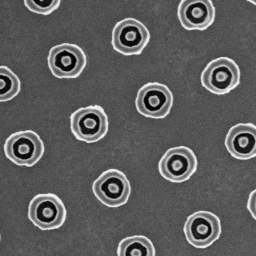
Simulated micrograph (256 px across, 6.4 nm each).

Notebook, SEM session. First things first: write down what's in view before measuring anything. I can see a regular array of ring-shaped raised bodies with a dot in the middle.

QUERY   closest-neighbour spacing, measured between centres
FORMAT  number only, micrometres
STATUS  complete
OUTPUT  0.43